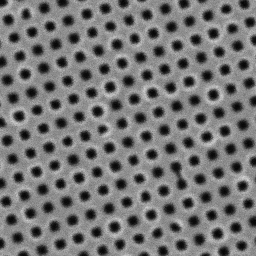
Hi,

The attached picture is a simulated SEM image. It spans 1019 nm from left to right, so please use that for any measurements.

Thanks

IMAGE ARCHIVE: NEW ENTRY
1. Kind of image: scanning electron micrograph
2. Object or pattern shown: a regular array of holes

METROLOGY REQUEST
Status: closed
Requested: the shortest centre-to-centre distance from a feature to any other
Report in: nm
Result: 75.2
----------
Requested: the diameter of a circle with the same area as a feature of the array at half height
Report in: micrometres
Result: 0.0451